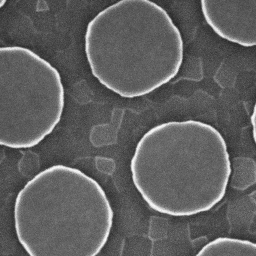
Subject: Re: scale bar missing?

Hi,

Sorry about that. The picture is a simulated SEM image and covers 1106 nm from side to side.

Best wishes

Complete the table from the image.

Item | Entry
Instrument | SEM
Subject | raised bodies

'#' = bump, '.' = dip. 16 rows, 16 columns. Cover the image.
.......###...###
......#####..###
.....######...##
##...######.....
###...#####.....
####...###......
####............
####............
###......#####..
........######..
...#....######..
..####..######..
.######..#####..
.######.........
.######.........
..####.......###